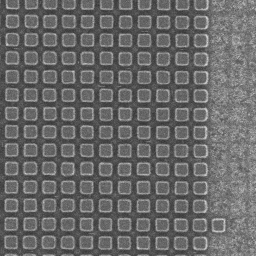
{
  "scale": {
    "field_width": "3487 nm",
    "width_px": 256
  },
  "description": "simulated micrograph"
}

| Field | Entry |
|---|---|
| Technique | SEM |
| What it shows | a regular array of raised bodies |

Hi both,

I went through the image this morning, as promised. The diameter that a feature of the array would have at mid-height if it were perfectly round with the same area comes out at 0.191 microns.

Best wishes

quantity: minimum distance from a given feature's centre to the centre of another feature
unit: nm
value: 247